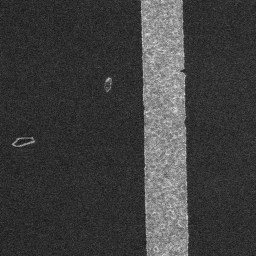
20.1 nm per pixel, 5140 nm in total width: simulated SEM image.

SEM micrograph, one or a few lines or trenches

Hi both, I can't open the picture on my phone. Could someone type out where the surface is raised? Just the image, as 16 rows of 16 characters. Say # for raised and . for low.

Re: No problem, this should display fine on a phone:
.........##.....
.........##.....
.........##.....
.........##.....
.........##.....
.........###....
.........###....
.........###....
.........###....
.........###....
.........###....
.........###....
.........###....
.........###....
.........###....
.........###....